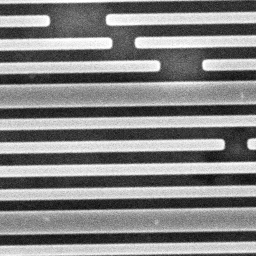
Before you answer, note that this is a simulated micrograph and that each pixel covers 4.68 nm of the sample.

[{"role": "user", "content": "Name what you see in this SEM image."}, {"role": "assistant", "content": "groups of lines, slits or small figures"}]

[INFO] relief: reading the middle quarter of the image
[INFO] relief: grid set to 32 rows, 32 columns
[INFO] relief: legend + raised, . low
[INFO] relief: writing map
++++++++++++++++++++++++........
+++++++++++++++++++++++.........
................................
................................
................................
++++++++++++++++++++++++++++++++
++++++++++++++++++++++++++++++++
++++++++++++++++++++++++++++++++
++++++++++++++++++++++++++++++++
++++++++++++++++++++++++++++++++
++++++++++......................
................................
................................
.............+++++++++++++++++++
++++++++++++++++++++++++++++++++
++++++++++++++++++++++++++++++++
................................
................................
................................
....++++++++++++++++++++++++++++
++++++++++++++++++++++++++++++++
+++++++++++++++++++++++++.......
................................
................................
................................
++++++++++++++++++++++++++++++++
++++++++++++++++++++++++++++++++
++++++++++++++++................
................................
................................
................................
++++++++++++++++++++++++++++++++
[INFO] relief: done